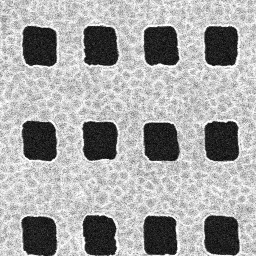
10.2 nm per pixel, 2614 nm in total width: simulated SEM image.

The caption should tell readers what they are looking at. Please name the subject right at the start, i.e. a regular array of holes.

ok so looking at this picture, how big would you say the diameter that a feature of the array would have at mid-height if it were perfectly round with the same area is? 406 nm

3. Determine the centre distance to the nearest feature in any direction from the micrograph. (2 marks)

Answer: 60.4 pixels